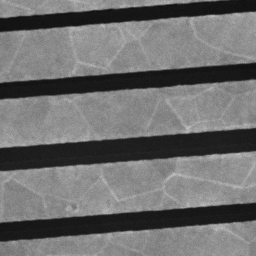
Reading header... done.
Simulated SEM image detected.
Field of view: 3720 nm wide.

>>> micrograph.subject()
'lines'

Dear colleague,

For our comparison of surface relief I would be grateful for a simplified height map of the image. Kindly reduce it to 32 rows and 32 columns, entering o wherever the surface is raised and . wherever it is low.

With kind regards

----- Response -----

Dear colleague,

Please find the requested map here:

ooooooooooooooooooooo...........
ooooooooo.......................
...................ooooooooooooo
........oooooooooooooooooooooooo
oooooooooooooooooooooooooooooooo
oooooooooooooooooooooooooooooooo
oooooooooooooooooooooooooooooooo
oooooooooooooooooooooooooooooooo
ooooooooooooooooooooooo.........
oooooooooo......................
.........................ooooooo
.............ooooooooooooooooooo
oooooooooooooooooooooooooooooooo
oooooooooooooooooooooooooooooooo
oooooooooooooooooooooooooooooooo
oooooooooooooooooooooooooooooooo
oooooooooooooooooooooooooo......
ooooooooooo.....................
................................
.........................ooooooo
............oooooooooooooooooooo
oooooooooooooooooooooooooooooooo
oooooooooooooooooooooooooooooooo
oooooooooooooooooooooooooooooooo
oooooooooooooooooooooooooooooooo
oooooooooooooooooooooooooooooo..
oooooooooooooooooo..............
ooo.............................
.....................ooooooooooo
.........ooooooooooooooooooooooo
oooooooooooooooooooooooooooooooo
oooooooooooooooooooooooooooooooo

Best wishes